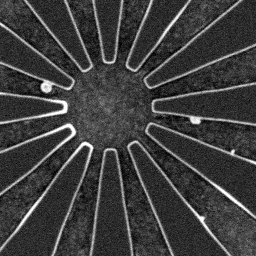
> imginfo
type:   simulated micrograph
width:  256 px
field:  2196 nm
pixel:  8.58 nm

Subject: groups of lines, slits or small figures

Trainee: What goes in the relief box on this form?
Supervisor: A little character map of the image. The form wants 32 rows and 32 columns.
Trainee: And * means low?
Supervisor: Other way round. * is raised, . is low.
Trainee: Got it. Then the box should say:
...*****....***....*****......**
....*****...***...*****.....****
.....****...***...****.....*****
*.....****..***...***.....******
**.....***..***..***....********
****...***...**..***...*********
*****...***..**.***...********..
******...**..*..**...******.....
..*****...*.....*...*****.......
....*****.........*****.........
.....****.........**...........*
.........................*******
******..............************
********...........*************
******.................*********
...............................*
......***.........****..........
....****...........******.......
.******...*.....**..*******.....
******...**..**.***...********..
*****...***..**..**....*********
****...****..**..***.....*******
**.....***...**...***.....******
*.....****..***...****.....*****
.....****...****..*****......***
....*****...****...*****......**
....*****...****...*****.......*
...*****....****....*****.......
..******....****....******......
.******.....****.....******.....
.******.....****.....*******....
*******....******....*******....